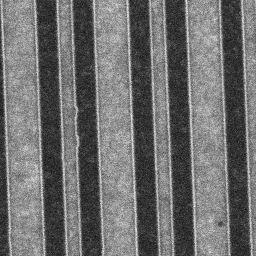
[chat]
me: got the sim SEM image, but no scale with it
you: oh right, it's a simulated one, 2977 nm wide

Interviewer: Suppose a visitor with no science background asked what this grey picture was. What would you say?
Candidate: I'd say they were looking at parallel lines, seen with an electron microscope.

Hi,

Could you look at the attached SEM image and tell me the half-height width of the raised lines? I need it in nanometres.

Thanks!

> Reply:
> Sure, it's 275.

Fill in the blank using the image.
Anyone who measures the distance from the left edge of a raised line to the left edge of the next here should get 46.2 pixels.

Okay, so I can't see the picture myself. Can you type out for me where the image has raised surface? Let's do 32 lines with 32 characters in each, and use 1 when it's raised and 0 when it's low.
00001110011100001110011000011100
00001110011100001110011000011100
00000110011100001110011000001100
00001110011100001110011000001100
00000110011100001110011000001100
00000110011100001110011000001110
00000110011100001110011000001110
10000110011100001110011100001110
10000110011100001110011100001110
10000111011100001110011100001110
10000111011100001110011100001110
10000111011100001110011100001110
10000111011100001110011100001110
10000111011100001110011100001110
10000111011100001110011100001110
10000111011100000110011100001110
10000111011100000110011100001110
10000111001100000110011100001110
10000111001100000110011100001110
10000111001100000110011100001110
10000111001110000110011100001110
10000111001110000110011100001110
10000111001110000111011100001110
10000111001110000111011100001110
10000111001110000111011100001110
10000111001110000111011100001110
10000111001110000111011100001110
10000111001110000111001100001110
10000111001110000111001100000110
10000111001110000111001100000110
10000111001110000111001100000110
10000111001110000111001100000111